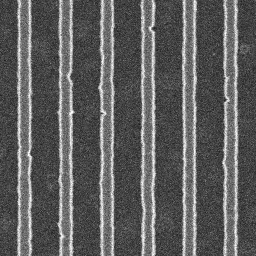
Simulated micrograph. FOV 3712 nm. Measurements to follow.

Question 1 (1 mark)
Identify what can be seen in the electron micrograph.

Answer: parallel lines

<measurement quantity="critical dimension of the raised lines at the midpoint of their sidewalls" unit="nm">168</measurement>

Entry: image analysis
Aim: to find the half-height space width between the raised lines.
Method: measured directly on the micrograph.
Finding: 419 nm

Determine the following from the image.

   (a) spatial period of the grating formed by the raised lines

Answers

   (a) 41.2 pixels